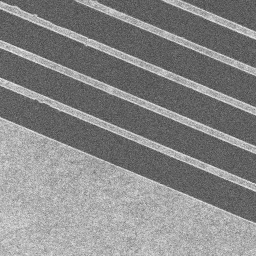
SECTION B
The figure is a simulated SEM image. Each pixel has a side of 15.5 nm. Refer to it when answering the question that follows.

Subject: parallel lines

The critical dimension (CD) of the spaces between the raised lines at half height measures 462 nm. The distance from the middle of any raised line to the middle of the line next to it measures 548 nanometers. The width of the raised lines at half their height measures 91.1 nanometres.